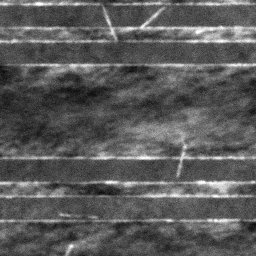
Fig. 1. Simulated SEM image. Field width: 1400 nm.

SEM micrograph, lines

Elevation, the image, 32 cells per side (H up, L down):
HHHHHHHHHHHHHHHHHLLLLHHLHHHHLLLH
LLLLLLLLLLLLLLLLLLLLLLLLLLLLLLLL
LLLLLLLLLLLLLLLLLLLLLLLLLLLLLLLL
HHHHHHHHHHHHHHHHHHHHHHHHHHHHHHHH
HHHHHHHHHHHHHHHHHHHHHHHHHHHHHHHH
LLLLLLLLLLLLLLLLLLLLLLLLLLLLLLLL
LLLLLLLLLLLLLLLLLLLLLLLLLLLLLLLL
LLLLLLLLLLLLLLLLLLLLLLLLLLLLLLLL
HHHHHHHHHHHHHHHHHHHHHHHHHHHHHHHH
HHHHHHHHHHHHHHHHHHHHHHHHHHHHHHHH
HHHHHHHHHHHHHHHHHHHHHHHHHHHHHHHH
HHHHHHHHHHHHHHHHHHHHHHHHHHHHHHHH
HHHHHHHHHHHHHHHHHHHHHHHHHHHHHHHH
HHHHHHHHHHHHHHHHHHHHHHHHHHHHHHHH
HHHHHHHHHHHHHHHHHHHHHHHHHHHHHHHH
HHHHHHHHHHHHHHHHHHHHHHHHHHHHHHHH
HHHHHHHHHHHHHHHHHHHHHHHHHHHHHHHH
HHHHHHHHHHHHHHHHHHHHHHHHHHHHHHHH
HHHHHHHHHHHHHHHHHHHHHHHHHHHHHHHH
HHHHHHHHHHHHHHHHHHHHHHHHHHHHHHHH
LLLLLLLLLLLLLLLLLLLLLLLLLLLLLLLL
LLLLLLLLLLLLLLLLLLLLLLLLLLLLLLLL
LLLLLLLLLLLLLLLLLLLLLLLLLLLLLLLL
HHHHHHHHHHHHHHHHHHHHHHHHHHHHHHHH
HHHHHHHHHHHHHHHHHHHHHHHHHHHHHHHH
LLLLLLLLLLLLLLLLLLLLLLLLLLLLLLLL
LLLLLLLLLLLLLLLLLLLLLLLLLLLLLLLL
LLLLLLLLLLLLLLLLLLHHHHLLLLLHHHHH
HHHHHHHHHHHHHHHHHHHHHHHHHHHHHHHH
HHHHHHHHHHHHHHHHHHHHHHHHHHHHHHHH
HHHHHHHHHHHHHHHHHHHHHHHHHHHHHHHH
HHHHHHHHHHHHHHHHHHHHHHHHHHHHHHHH